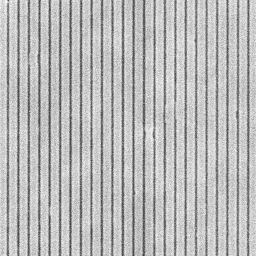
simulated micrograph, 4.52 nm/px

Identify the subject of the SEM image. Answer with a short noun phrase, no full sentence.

parallel lines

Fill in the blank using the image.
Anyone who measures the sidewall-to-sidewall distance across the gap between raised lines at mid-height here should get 11.9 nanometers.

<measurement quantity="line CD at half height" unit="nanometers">35.6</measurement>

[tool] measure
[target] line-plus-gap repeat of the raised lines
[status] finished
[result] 47.2 nm